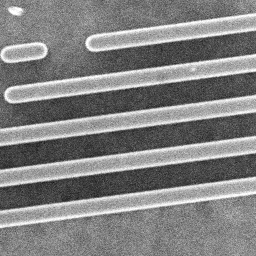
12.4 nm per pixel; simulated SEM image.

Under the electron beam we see groups of lines, slits or small figures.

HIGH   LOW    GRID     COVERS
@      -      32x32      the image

--------------------------------
--------------------------------
--------------------------@@@@@@
------------------@@@@@@@@@@@@@@
-----------@@@@@@@@@@@@@@@------
---@@------@@@@@@@@-------------
@@@@@@--------------------------
@@@@-----------------------@@@@@
-------------------@@@@@@@@@@@@@
------------@@@@@@@@@@@@@@@-----
----@@@@@@@@@@@@@@@-------------
-@@@@@@@@@@@@-------------------
-@@@@-----------------------@@@@
--------------------@@@@@@@@@@@@
-------------@@@@@@@@@@@@@@@----
-----@@@@@@@@@@@@@@@------------
@@@@@@@@@@@@@-------------------
@@@@@@-----------------------@@@
---------------------@@@@@@@@@@@
-------------@@@@@@@@@@@@@@@@---
------@@@@@@@@@@@@@@@-----------
@@@@@@@@@@@@@-------------------
@@@@@@@-----------------------@@
----------------------@@@@@@@@@@
--------------@@@@@@@@@@@@@@@@--
-------@@@@@@@@@@@@@@@----------
@@@@@@@@@@@@@@------------------
@@@@@@@-------------------------
--------------------------------
--------------------------------
--------------------------------
--------------------------------